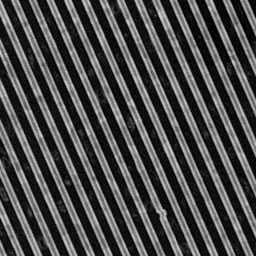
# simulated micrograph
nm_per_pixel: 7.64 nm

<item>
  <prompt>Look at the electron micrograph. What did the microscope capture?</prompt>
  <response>parallel lines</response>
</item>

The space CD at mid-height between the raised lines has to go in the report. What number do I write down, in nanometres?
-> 88.4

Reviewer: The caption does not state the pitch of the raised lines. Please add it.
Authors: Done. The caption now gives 123 nm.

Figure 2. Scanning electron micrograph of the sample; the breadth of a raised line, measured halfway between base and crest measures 34.1 nanometers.